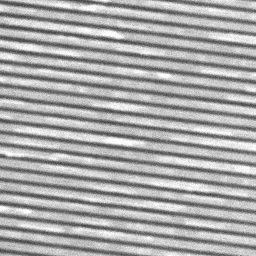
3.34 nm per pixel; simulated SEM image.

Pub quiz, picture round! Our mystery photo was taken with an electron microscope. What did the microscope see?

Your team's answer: parallel lines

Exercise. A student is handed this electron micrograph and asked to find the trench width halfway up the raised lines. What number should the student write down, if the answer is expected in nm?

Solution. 20.3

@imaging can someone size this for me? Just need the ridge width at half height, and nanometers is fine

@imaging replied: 20.3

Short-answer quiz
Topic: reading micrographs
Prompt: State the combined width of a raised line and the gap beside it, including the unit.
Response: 39.3 nanometres